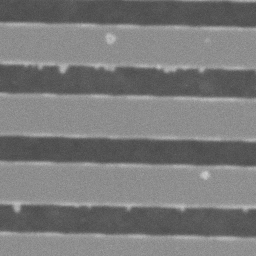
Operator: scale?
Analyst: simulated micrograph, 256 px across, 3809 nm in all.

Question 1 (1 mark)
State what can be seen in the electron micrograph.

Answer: lines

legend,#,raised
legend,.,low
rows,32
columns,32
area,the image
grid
................................
................................
................................
##############################..
################################
################################
################################
################################
...........................#####
................................
................................
................................
################################
################################
################################
################################
################################
..............................##
................................
................................
#############...................
################################
################################
################################
################################
.......#########################
................................
................................
................................
###################.............
################################
################################